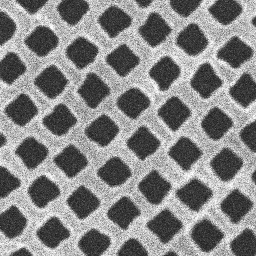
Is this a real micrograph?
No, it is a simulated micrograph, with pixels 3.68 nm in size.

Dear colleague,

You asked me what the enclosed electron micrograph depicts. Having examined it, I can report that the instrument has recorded a regular array of holes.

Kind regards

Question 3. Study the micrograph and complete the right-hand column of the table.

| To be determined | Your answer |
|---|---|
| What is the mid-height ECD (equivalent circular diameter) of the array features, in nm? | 109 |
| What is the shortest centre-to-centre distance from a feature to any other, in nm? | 149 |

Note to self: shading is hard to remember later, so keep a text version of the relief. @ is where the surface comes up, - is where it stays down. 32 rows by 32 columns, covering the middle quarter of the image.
@@@---@@@@@-------@@@@-------@@@
@@@@@@@@@@@@@----@@@@--------@@@
@@@@@@--@@@@@---@@@@@--------@@@
@@@@@@---@@@@@@@@@@@@@------@@@@
-@@@@-----@@@@@@@@@@@@@----@@@@@
-@@@-------@@@@@@@@@@@@@--@@@@@@
@@@@--------@@@@---@@@@@--@@@@@@
@@@@-------@@@@-----@@@@@@@@@@@@
@@@@@-----@@@@-------@@@@@@--@@@
@@@@@----@@@@---------@@@-----@@
-@@@@@--@@@@@---------@@-------@
-@@@@@@@@@@@@@------@@@@--------
--@@@@@@@@@@@@@----@@@@---------
---@@@@@@---@@@@@-@@@@@@-------@
---@@@@-----@@@@@@@@@@@@@-----@@
--@@@@@------@@@@@@@@@@@@@---@@@
-@@@@---------@@@@---@@@@@@-@@@@
@@@@@--------@@@@-----@@@@@@@@@@
@@@@@@------@@@@-------@@@@@@--@
@@@@@@@@----@@@@--------@@@@----
@-@@@@@@@--@@@@@--------@@@-----
---@@@@@@@@@@@@@@------@@@------
-----@@@@@@@@@@@@@----@@@@------
------@@@@@@--@@@@@-@@@@@@@-----
------@@@@-----@@@@@@@@@@@@@----
------@@@@------@@@@@@@@@@@@@---
----@@@@--------@@@@@@@@@@@@@@-@
---@@@@@---------@@@@---@@@@@@@@
@-@@@@@@@-------@@@@-----@@@@@@@
@@@@@@@@@@-----@@@@-------@@@@@-
@@@@-@@@@@@@--@@@@---------@@@--
@@@---@@@@@@@@@@@@@-------@@@---